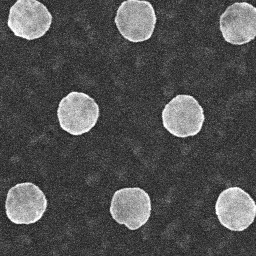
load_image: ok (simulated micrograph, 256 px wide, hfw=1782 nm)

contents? raised bodies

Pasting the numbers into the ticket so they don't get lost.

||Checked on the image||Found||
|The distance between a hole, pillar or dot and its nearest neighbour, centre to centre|729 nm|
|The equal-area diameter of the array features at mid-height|282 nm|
